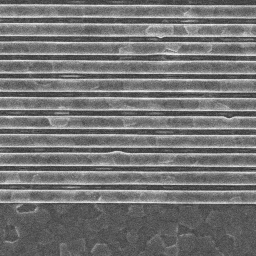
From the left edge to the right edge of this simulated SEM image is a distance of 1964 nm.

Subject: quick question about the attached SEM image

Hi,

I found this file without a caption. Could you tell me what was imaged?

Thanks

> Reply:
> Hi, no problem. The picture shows parallel lines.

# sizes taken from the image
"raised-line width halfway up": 97.8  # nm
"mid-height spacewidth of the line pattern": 45.1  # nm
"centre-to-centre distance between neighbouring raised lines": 142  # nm